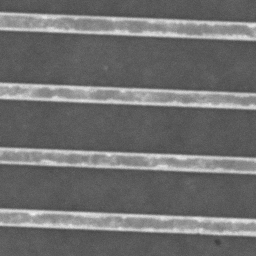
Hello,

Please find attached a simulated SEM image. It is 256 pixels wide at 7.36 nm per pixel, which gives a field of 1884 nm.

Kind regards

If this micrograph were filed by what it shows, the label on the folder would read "one or a few lines or trenches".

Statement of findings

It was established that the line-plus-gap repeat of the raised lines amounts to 481 nm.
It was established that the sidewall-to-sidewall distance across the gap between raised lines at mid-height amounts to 378 nanometers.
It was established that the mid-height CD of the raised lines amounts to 103 nm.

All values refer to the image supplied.